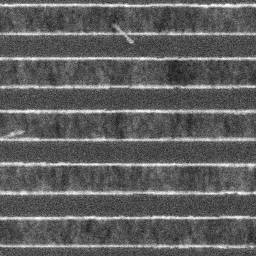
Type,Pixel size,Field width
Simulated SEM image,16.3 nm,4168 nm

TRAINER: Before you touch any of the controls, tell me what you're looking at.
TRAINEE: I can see lines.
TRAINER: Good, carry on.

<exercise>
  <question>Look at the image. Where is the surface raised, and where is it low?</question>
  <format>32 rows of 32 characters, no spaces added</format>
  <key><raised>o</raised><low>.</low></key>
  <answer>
................................
oooooooooooooooooooooooooooooooo
oooooooooooooooooooooooooooooooo
oooooooooooooooooooooooooooooooo
................................
................................
................................
oooooooooooooooooooooooooooooooo
oooooooooooooooooooooooooooooooo
oooooooooooooooooooooooooooooooo
oooooooooooooooooooooooooooooooo
................................
................................
................................
oooooooooooooooooooooooooooooooo
oooooooooooooooooooooooooooooooo
oooooooooooooooooooooooooooooooo
ooo.ooooooooooooooooooo...o.....
................................
................................
................................
oooooooooooooooooooooooooooooooo
oooooooooooooooooooooooooooooooo
oooooooooooooooooooooooooooooooo
................................
................................
................................
oooooooooooooooooooooooooooooooo
oooooooooooooooooooooooooooooooo
oooooooooooooooooooooooooooooooo
oooooooooooooooooooooooooooooooo
................................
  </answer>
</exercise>